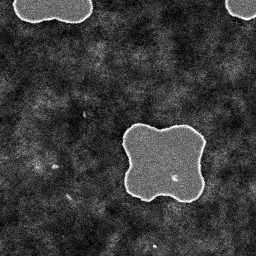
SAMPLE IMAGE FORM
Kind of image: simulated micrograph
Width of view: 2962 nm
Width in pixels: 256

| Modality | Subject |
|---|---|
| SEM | raised bodies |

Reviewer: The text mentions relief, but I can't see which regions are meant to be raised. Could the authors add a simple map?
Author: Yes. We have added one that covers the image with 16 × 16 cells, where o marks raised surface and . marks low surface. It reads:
.ooooo........oo
................
................
................
................
................
................
................
........ooooo...
........ooooo...
........ooooo...
........ooooo...
...........o....
................
................
................